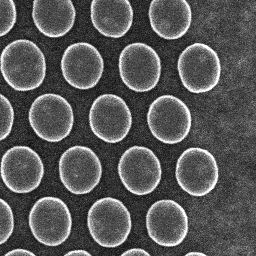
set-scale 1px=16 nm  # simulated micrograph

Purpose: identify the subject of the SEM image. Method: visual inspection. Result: a regular array of raised bodies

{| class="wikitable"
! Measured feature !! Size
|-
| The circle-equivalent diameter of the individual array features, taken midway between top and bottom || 710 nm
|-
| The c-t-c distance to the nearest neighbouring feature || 934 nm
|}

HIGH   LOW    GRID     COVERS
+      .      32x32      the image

++..+++++...++++...++++.........
++..+++++..++++++..+++++........
++..+++++...+++++..+++++........
+....++++...++++...++++.........
......+.......+.....+++.........
.+++......+......+..............
+++++...++++...++++....++++.....
+++++...+++++..+++++..+++++.....
++++++..+++++..+++++..+++++.....
+++++...+++++..+++++...++++.....
.++++....+++....+++....++++.....
........................+.......
+....+++....+++.....++..........
+...+++++..+++++...++++.........
++..+++++..+++++..++++++........
++..+++++..+++++...+++++........
+....++++...++++...++++.........
......+......++.....+++.........
..+......++......+..............
.++++...++++...++++....+++......
+++++...+++++..+++++..+++++.....
+++++...+++++..+++++..+++++.....
+++++...++++...+++++..+++++.....
.+++....++++....+++....+++......
................................
+....+++....+++....+++..........
+...++++...+++++...++++.........
++..+++++..+++++..+++++.........
++..+++++..+++++..+++++.........
+...++++....++++...++++.........
......+......++.....++..........
.+++.....++.....++..............